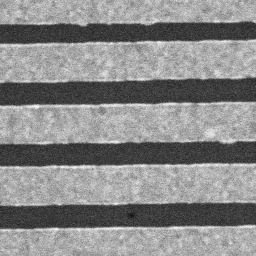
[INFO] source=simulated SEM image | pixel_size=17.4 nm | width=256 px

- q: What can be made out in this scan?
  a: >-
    lines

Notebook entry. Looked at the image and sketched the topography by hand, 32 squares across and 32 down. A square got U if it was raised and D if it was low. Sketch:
UUUUUUUUUUUUUUUUUUUUUUUUUUUUUUUU
UUUUUUUUUUUUUUUUUUUUUUUUUUUUUUUU
UUUUUUUUUUUUUUUUUUUUUUUUUUUUUUUU
DDDDDDDDDDDDDDDDDDDDDDDDDDDDDDDD
DDDDDDDDDDDDDDDDDDDDDDDDDDDDDDDD
DDDDDDDDDDDUUUUUUUUUUUUUUUUUUUUU
UUUUUUUUUUUUUUUUUUUUUUUUUUUUUUUU
UUUUUUUUUUUUUUUUUUUUUUUUUUUUUUUU
UUUUUUUUUUUUUUUUUUUUUUUUUUUUUUUU
UUUUUUUUUUUUUUUUUUUUUUUUUUUUUUUU
DDDDDDDDDDDDDDDDDDDDDDDDDDDDDDDD
DDDDDDDDDDDDDDDDDDDDDDDDDDDDDDDD
DDDDDDDDDDDDDDDDDDDDDDDDDDDDDDDD
UUUUUUUUUUUUUUUUUUUUUUUUUUUUUUUU
UUUUUUUUUUUUUUUUUUUUUUUUUUUUUUUU
UUUUUUUUUUUUUUUUUUUUUUUUUUUUUUUU
UUUUUUUUUUUUUUUUUUUUUUUUUUUUUUUU
UUUUUUUUUUUUUUUUUUUUUUUUUUUUUUUU
DDDDDDDDDDDDDDDDDDDDDDDDDDDDDDDD
DDDDDDDDDDDDDDDDDDDDDDDDDDDDDDDD
DDDDDDDDDDDDDDDDDDDDDDDDDDDDDDDD
UUUUUUUUUUUUUUUUUUUUUUUUUUUUUUUU
UUUUUUUUUUUUUUUUUUUUUUUUUUUUUUUU
UUUUUUUUUUUUUUUUUUUUUUUUUUUUUUUU
UUUUUUUUUUUUUUUUUUUUUUUUUUUUUUUU
UUUUUUDDDDDDDDDDDDDDDDDDDDDDDDDD
DDDDDDDDDDDDDDDDDDDDDDDDDDDDDDDD
DDDDDDDDDDDDDDDDDDDDDDDDDDDDDDDD
DDDDDDDDDDDDDDDDDDDDDDDUUUUUUUUU
UUUUUUUUUUUUUUUUUUUUUUUUUUUUUUUU
UUUUUUUUUUUUUUUUUUUUUUUUUUUUUUUU
UUUUUUUUUUUUUUUUUUUUUUUUUUUUUUUU